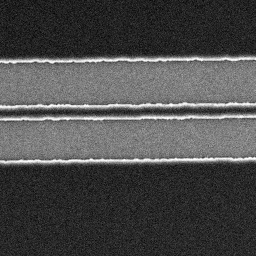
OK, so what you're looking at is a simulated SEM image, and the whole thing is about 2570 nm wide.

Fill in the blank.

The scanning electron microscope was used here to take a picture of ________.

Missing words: lines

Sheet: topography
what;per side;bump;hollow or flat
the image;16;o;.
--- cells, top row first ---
oooooooooooooooo
oooooooooooooooo
oooooooooooooooo
oooooooooooooooo
................
................
..............oo
................
................
................
oooooooooooooooo
oooooooooooooooo
oooooooooooooooo
oooooooooooooooo
oooooooooooooooo
oooooooooooooooo